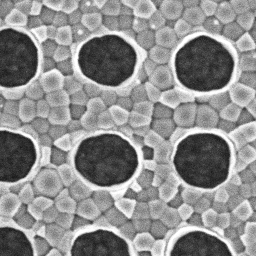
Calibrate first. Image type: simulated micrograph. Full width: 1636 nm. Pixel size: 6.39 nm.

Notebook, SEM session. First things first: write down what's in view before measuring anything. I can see holes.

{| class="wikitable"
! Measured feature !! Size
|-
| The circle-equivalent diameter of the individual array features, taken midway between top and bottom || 375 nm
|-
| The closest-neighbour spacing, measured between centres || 614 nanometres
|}